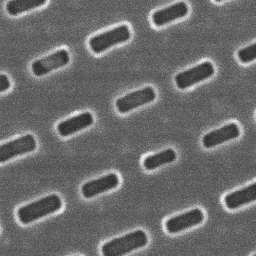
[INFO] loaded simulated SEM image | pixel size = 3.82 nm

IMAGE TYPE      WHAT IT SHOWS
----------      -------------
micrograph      a regular array of holes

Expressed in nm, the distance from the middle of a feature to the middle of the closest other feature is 245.